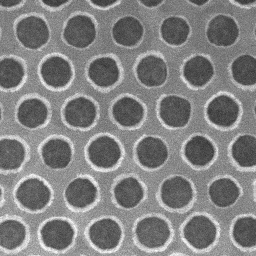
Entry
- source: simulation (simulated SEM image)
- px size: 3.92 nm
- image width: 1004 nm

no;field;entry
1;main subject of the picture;a regular array of holes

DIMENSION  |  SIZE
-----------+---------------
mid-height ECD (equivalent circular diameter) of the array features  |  0.124 microns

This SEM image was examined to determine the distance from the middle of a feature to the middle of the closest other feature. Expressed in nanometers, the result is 182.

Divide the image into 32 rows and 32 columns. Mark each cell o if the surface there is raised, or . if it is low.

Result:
..oooo..oooo..oooo..oooo.ooooo.o
oooooooooooooooooooooooooooooooo
ooo..oooo...ooo..oooo..ooo...ooo
oo....oo....oo....oo....oo....oo
oo....oo....oo....oo....oo....oo
ooo...ooo..oooo..oooo..oooo..ooo
oooooooooooooooooooooooooooooooo
..oooo..oooo..oooo..oooo..ooo...
...oo....oo....oo....oo....oo...
...oo....oo....oo....oo....oo...
..oooo..oooo..oooo..oooo..oooo..
oooooooooooooooooooooooooooooooo
ooo..oooo..oooo..ooo...oooo..ooo
oo....oo....oo....oo....oo....oo
oo....oo....oo....oo....oo....oo
ooo..oooo...ooo..oooo..oooo..ooo
oooooooooooooooooooooooooooooooo
..oooo..oooo..oooo..oooo..ooo...
...oo....oo....oo....oo....oo...
...oo....oo....oo....oo....oo...
...ooo...ooo..oooo..oooo..oooo..
oooooooooooooooooooooooooooooooo
ooo..oooo..oooo..oooo..oooo..ooo
oo....oo....oo....oo....oo....oo
oo....oo....oo....oo....oo....oo
ooo...ooo..oooo..oooo...ooo..ooo
oooooooooooooooooooooooooooooooo
o.oooooooooo..oooo..oooo..oooo..
...oo....oo....oo....oo....oo...
...oo....oo....oo....oo....oo...
...ooo...ooo...ooo...ooo..oooo..
oooooooooooooooooooooooooooooooo